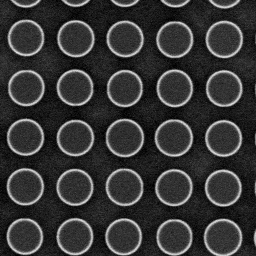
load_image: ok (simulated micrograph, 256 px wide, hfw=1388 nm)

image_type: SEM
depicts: an array of small figures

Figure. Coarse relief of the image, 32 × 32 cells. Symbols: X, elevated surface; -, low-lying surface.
--XXX---XXX----XX----XX----XXX--
--------------------------------
--------------------------------
-XXXX---XXX---XXX---XXXX--XXXX--
-XXXX--XXXXX-XXXXX--XXXX--XXXX--
-XXXX--XXXXX-XXXXX--XXXX--XXXX--
--XXX---XXX---XXX---XXX---XXXX--
--------------------------------
--------------------------------
--XXX---XXX---XXX---XXX---XXXX--
-XXXX--XXXXX-XXXXX--XXXX--XXXX--
-XXXX--XXXXX-XXXXX--XXXX--XXXX--
--XXX---XXX---XXX---XXXX--XXXX--
--------------------------------
--------------------------------
--XXX---XXX---XXX---XXX----XX---
-XXXX--XXXXX-XXXXX--XXXX--XXXX--
-XXXX--XXXXX-XXXXX-XXXXX--XXXX--
-XXXX---XXX---XXXX--XXXX--XXXX--
---------------X-----X-----X----
--------------------------------
--XX----XXX---XXX----XX----XX---
-XXXX--XXXX--XXXXX--XXXX--XXXX--
-XXXX--XXXXX-XXXXX-XXXXX--XXXX--
-XXXX--XXXX---XXXX--XXXX--XXXX--
--XX----XX-----XX----XX----XX---
--------------------------------
--XX-----X-----X-----------XX---
-XXXX--XXXX---XXX---XXXX--XXXX--
-XXXX--XXXXX-XXXXX--XXXX--XXXX--
-XXXX--XXXX--XXXXX--XXXX--XXXX--
--XX----XX----XXX----XX---XXX---